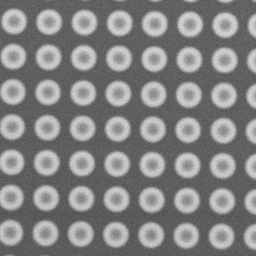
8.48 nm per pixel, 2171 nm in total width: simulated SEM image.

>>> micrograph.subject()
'an array of small figures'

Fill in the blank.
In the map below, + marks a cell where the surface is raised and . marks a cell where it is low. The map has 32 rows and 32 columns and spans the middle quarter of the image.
...++++....+++++....+++++....+++
....+........++......+++......++
................................
................................
...+++.......++.................
..+++++....+++++....+++++....+++
..++++++...++++++..++++++...++++
..++++++...++++++..++++++...++++
..++++++...++++++..++++++...++++
...++++....+++++....+++++....+++
.....................+++......++
................................
................................
...+++......+++......+++......++
..+++++....+++++....+++++....+++
..++++++..++++++...++++++...++++
..++++++..++++++...++++++...++++
..+++++....+++++...++++++...++++
...++++....+++++....+++++....+++
..............................++
................................
................................
...+++......+++......+++......++
..+++++....+++++....+++++...++++
.+++++++..++++++...++++++...++++
.+++++++..++++++...++++++...++++
..+++++....+++++...++++++...++++
...+++.....++++.....++++.....+++
................................
................................
................................
..+++++....++++.....++++.....+++